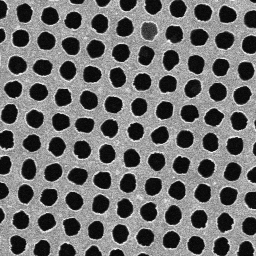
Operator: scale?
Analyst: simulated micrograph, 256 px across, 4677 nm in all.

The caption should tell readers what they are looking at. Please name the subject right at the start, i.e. a regular array of holes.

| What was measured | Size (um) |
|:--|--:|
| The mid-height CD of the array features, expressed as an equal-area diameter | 0.319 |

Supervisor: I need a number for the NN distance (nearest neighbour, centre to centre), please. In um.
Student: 0.452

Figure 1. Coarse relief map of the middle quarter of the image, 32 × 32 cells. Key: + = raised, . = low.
...++++++++++++++++++++++...+++.
...++....+++...+++++++++++.++++.
...++....+++...++++..+++++++++++
..+++....++....+++....+++...++++
++++++..++++...++.....++....+++.
++++++++++++...+++....++....++..
.++++++++++++++++++.++++....++..
..++....++++++++++++++++++++++..
..++....+++...++++.+++++++++++++
..++....++.....++....+++..++++++
+++++...++.....++....++....+++..
+++++++++++...+++....++....++...
+++++++++++++++++...+++....++...
.+++..++++++++++++++++++..++++..
.++....+++...++++++++++++++++++.
.++....++....++++...++++++++++++
+++....++.....++....+++...++++++
++++++++++...+++....++....+++...
+++++++++++++++++..+++....++....
+++...++++++++++++++++....++....
++....++++..+++++++++++++++++..+
++.....++....+++..++++++++++++++
+++....++....++....+++..++++++++
++++..+++....++....++....+++...+
++++++++++..+++....++....++....+
++++++++++++++++..++++...++....+
++...++++++++++++++++++.++++...+
+.....++...+++++++++++++++++++++
+.....+.....+++...++++..++++++++
++...++.....++....+++...++++.+++
++++++++...+++....++....+++...++
++++++++++++++...+++....++....++